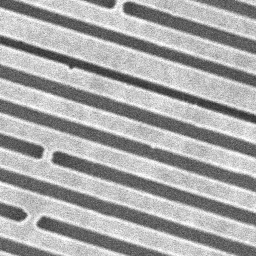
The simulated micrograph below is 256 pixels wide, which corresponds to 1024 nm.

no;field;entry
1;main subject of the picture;parallel lines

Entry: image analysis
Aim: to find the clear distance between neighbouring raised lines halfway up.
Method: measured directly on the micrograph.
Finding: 54.4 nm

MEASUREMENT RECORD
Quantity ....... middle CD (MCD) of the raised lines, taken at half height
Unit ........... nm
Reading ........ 74.5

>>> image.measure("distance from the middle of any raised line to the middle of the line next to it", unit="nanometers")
131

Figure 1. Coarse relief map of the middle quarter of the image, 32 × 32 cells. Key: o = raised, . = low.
o........ooooooooooooooooooooo..
oooo........oooooooooooooooooooo
oooooooo.......ooooooooooooooooo
ooooooooooo........ooooooooooooo
ooooooooooooooo.......oooooooooo
..oooooooooooooo.........ooooooo
.....ooooooooooooooo........oooo
........oooooooooooooooo.......o
............ooooooooooooooo.....
ooo...........oooooooooooooooo..
oooooo............oooooooooooooo
ooooooooo............ooooooooooo
ooooooooooooo...........oooooooo
oooooooooooooooo...........ooooo
...oooooooooooooooo...........oo
.......ooooooooooooooo..........
..........ooooooooooooooo.......
o............oooooooooooooooo...
oooo............oooooooooooooooo
ooooooo............ooooooooooooo
oooooooooo............oooooooooo
oooooooooooooo...........ooooooo
.oooooooooooooooo...........oooo
....oooooooooooooooo............
........ooooooooooooooo.........
...........ooooooooooooooo......
oo............oooooooooooooooo..
ooooo............ooooooooooooooo
oooooooo.............ooooooooooo
oooooooooooo............oooooooo
ooooooooooooooo............ooooo
..oooooooooooooooo............oo